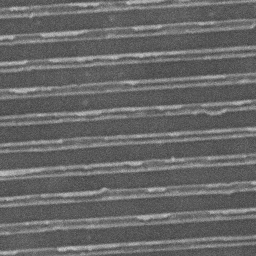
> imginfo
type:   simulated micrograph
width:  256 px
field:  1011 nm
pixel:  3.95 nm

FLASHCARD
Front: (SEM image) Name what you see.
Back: parallel lines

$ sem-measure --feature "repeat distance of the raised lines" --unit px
26.9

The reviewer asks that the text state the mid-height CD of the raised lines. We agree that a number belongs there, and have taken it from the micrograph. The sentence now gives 9.11 px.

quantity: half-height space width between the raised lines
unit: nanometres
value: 69